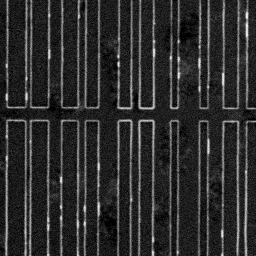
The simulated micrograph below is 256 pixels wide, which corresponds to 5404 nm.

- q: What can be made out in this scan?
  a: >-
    groups of lines, slits or small figures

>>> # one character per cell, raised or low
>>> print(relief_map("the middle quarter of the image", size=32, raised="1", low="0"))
00001000011111000110000111100111
00001000011111000110000111100111
00001000011111000110000111100111
00001000011111000110000111100111
00001000011111000110000111100111
00001000011111000110000111100111
00001000011111000110000111100111
00001000011111000110000111100111
00001000011111000110000111100111
00001000011111000110000111100111
00011000011111000110000111101111
11111111111111111111111111111111
11111111111111111111111111111111
11111111111111111111111111111111
00011000111111000110001111101111
00001000011111000110000111100111
00001000011111000110000111100111
00001000011111000110000111100111
00001000011111000110000111100111
00001000011111000110000111100111
00001000011111000110001111100111
00011000011111000110001111100111
00011000011111000110001111101111
00011000011111000110001111101111
00011000011111000110001111100111
00011000011111000110001111100111
00011000011111000110001111000111
00011000011111000110001111000111
00011000011111000110001111000111
00011000011111000110001111000111
00011000011111000110001111000111
00011000011111000110001111001111